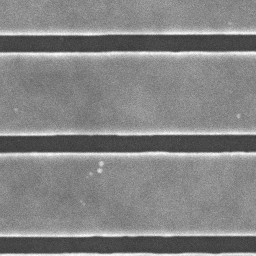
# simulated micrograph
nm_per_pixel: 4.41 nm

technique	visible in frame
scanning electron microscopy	lines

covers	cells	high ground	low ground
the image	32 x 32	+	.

++++++++++++++++++++++++++++++++
++++++++++++++++++++++++++++++++
++++++++++++++++++++++++++++++++
++++++++++++++++++++++++++++++++
................................
................................
.............+++++++++++++++++++
++++++++++++++++++++++++++++++++
++++++++++++++++++++++++++++++++
++++++++++++++++++++++++++++++++
++++++++++++++++++++++++++++++++
++++++++++++++++++++++++++++++++
++++++++++++++++++++++++++++++++
++++++++++++++++++++++++++++++++
++++++++++++++++++++++++++++++++
++++++++++++++++++++++++++++++++
++++++++++++++++++++++++++++++++
................................
................................
++++++++++++++++++++++++++++++++
++++++++++++++++++++++++++++++++
++++++++++++++++++++++++++++++++
++++++++++++++++++++++++++++++++
++++++++++++++++++++++++++++++++
++++++++++++++++++++++++++++++++
++++++++++++++++++++++++++++++++
++++++++++++++++++++++++++++++++
++++++++++++++++++++++++++++++++
++++++++++++++++++++++++++++++++
+++++++++++++++++...++..........
................................
................................